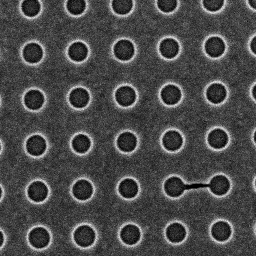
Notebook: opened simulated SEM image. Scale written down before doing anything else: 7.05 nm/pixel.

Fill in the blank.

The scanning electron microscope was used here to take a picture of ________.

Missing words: a regular array of holes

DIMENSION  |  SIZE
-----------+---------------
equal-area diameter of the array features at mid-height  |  21.5 pixels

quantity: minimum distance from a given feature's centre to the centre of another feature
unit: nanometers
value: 319